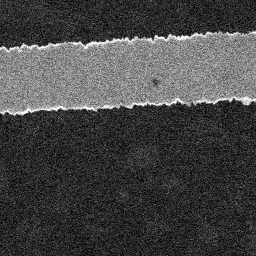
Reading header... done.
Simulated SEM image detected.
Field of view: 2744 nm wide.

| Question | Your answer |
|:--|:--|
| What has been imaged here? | one or a few lines or trenches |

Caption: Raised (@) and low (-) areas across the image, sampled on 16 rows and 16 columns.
----------------
----------------
-------@@@@@@@@@
@@@@@@@@@@@@@@@@
@@@@@@@@@@@@@@@@
@@@@@@@@@@@@@@@@
@@@@@@@@@@@-----
----------------
----------------
----------------
----------------
----------------
----------------
----------------
----------------
----------------